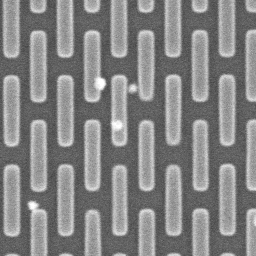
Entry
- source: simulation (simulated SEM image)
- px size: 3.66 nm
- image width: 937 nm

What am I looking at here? groups of lines, slits or small figures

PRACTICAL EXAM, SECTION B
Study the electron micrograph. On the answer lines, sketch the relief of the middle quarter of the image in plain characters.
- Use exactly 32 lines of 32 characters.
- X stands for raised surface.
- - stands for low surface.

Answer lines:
-----XXXX----------XXX----------
-----XXXX----------XXX----------
-----XXXX----------XXX----------
XX---XXXX---XXX----XXX----XXX---
XX---XXXXX--XXX----XXX----XXX---
XX---XXXXX--XXX----XXX----XXX---
XX---XXXX---XXX----XXX----XXX---
XX---XXXX---XXX----XXX----XXX---
XX---XXXX---XXX----XXX----XXX---
XX----------XXX-----------XXX---
XX----------XXX-----------XXX---
XX----------XXX-----------XXX---
XX----------XXX-----------XXX---
XX----------XXX-----------XXX---
XX----XX----XXX-----------XXX---
XX---XXXX---XXX----XXX----XXX---
XX---XXXX---XXX----XXX----XXX---
XX---XXXX---XXX----XXX----XXX---
XX---XXXX---XXX----XXX----XXX---
XX---XXXX---XXX----XXX----XXX---
-----XXXX----------XXX----------
-----XXXX----------XXX----------
-----XXXX----------XXX----------
-----XXXX----------XXX----------
-----XXXX----------XXX----------
XX---XXXX----------XXX----------
XX---XXXX----XX----XXX----XXX---
XX---XXXX---XXX----XXX----XXX---
XX---XXXX---XXX----XXX----XXX---
XX---XXXX----XX----XXX----XXX---
XX---XXXX----XX----XXX----XXX---
XX-----------XX-----------XXX---